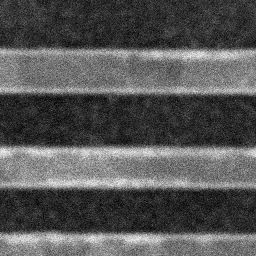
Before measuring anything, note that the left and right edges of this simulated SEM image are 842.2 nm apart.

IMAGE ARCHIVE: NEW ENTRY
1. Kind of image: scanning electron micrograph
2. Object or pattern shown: one or a few lines or trenches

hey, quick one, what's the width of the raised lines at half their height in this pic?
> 0.125 µm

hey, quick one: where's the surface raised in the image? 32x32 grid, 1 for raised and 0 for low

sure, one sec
00000000000000000000000000000000
00000000000000000000000000000000
00000000000000000000000000000000
00000000000000000000000000000000
00000000000000000000000000000000
00000000000000000000000000000000
00000000000000000011100000001000
11111111111111111111111111111111
11111111111111111111111111111111
11111111111111111111111111111111
11111111111111111111111111111111
00000000000000000000000000000000
00000000000000000000000000000000
00000000000000000000000000000000
00000000000000000000000000000000
00000000000000000000000000000000
00000000000000000000000000000000
00000000000000000000000000000000
00000000000000000000100000000000
11111111111111111111111111111111
11111111111111111111111111111111
11111111111111111111111111111111
11111111111111111111111111111111
00000000000000000000000000000000
00000000000000000000000000000000
00000000000000000000000000000000
00000000000000000000000000000000
00000000000000000000000000000000
00000000000000000000000000000000
00001111000000000100000000000000
11111111111111111111111111111111
11111111111111111111111111111111